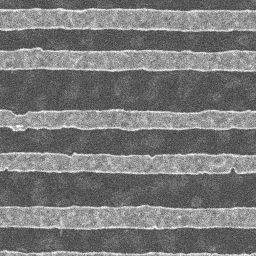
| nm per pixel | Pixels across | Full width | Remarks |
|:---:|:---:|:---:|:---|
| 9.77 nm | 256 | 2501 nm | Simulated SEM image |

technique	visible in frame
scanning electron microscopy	parallel lines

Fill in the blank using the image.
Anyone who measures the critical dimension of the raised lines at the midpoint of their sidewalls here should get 0.184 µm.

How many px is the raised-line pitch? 49.5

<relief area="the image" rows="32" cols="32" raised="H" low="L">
LLLLLLLLLLLLLLLLLLLLLLLLLLLLLLLL
HHHHHHHHHHHHHHHHHHHHHHHHHHHHHHHH
HHHHHHHHHHHHHHHHHHHHHHHHHHHHHHHH
HHHHHHHLHHHHHHHHHHHHHHHHHHHHHHHH
LLLLLLLLLLLLLLLLLLLLLLLLLLLLLLLL
LLLLLLLLLLLLLLLLLLLLLLLLLLLLLLLL
HHHHHHHHHHHHHHHHHHHHHLHHLLLLHHHH
HHHHHHHHHHHHHHHHHHHHHHHHHHHHHHHH
HHHHHHHHHHHHHHHHHHHHHHHHHHHHHHHH
LLLLLLLLLLLLLLLLLLLLLLLLLLLLLLLL
LLLLLLLLLLLLLLLLLLLLLLLLLLLLLLLL
LLLLLLLLLLLLLLLLLLLLLLLLLLLLLLLL
LLLLLLLLLLLLLLLLLLLLLLLLLLLLLLLL
LLLLLLLLLLLLLLLLLLLLLLLLLLLLLLLL
HHHHHHHHHHHHHHHHHHHHHHHHHHHHHHHH
HHHHHHHHHHHHHHHHHHHHHHHHHHHHHHHH
LLLLLLLLLLLLLLLLLLLLLLLLLLLLLLLL
LLLLLLLLLLLLLLLLLLLLLLLLLLLLLLLL
LLLLLLLLLLLLLLLLLLLLLLLLLLLLLLLL
HHHHHHHHHHHHHHHHHHLLHHHHHHHHHHHH
HHHHHHHHHHHHHHHHHHHHHHHHHHHHHHHH
LLLLLLLHLLLLLHHHHHHHHHHHHHHHLLHL
LLLLLLLLLLLLLLLLLLLLLLLLLLLLLLLL
LLLLLLLLLLLLLLLLLLLLLLLLLLLLLLLL
LLLLLLLLLLLLLLLLLLLLLLLLLLLLLLLL
LLLLLLLLLLLLLLLLLLLLLLLLHLLLLLLL
HHHHHHHHHHHHHHHHHHHHHHHHHHHHHHHH
HHHHHHHHHHHHHHHHHHHHHHHHHHHHHHHH
LLLLLLLHHHHHLLLLLHHHHHLLLLLLLLHL
LLLLLLLLLLLLLLLLLLLLLLLLLLLLLLLL
LLLLLLLLLLLLLLLLLLLLLLLLLLLLLLLL
HHLLLLLHHLLLLLLLLLLLLLLLLLLLLLLL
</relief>